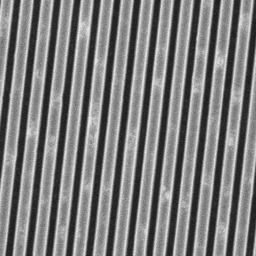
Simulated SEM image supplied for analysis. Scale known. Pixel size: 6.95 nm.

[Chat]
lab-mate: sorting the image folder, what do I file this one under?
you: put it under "parallel lines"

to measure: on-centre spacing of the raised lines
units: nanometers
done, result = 138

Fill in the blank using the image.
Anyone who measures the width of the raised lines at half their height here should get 82.1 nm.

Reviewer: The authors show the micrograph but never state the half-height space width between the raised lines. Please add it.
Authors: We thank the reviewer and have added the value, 0.0561 microns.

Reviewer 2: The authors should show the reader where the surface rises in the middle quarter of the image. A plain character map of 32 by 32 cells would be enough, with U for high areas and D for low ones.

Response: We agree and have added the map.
DDDUUDDDUUDDDUUUDDUUUDDUUUDDUUDD
DDUUUDDUUUDDUUUDDUUUDDUUUDDUUUDD
DDUUUDDUUUDDUUUDDUUUDDUUUDDUUUDD
DDUUUDDUUUDDUUUDDUUUDDUUUDDUUUDD
DDUUUDDUUUDDUUUDDUUUDDUUUDDUUUDD
DDUUUDDUUUDDUUUDDUUUDDUUUDDUUUDD
DDUUUDDUUUDDUUUDDUUUDDUUUDDUUUDD
DDUUUDDUUUDDUUUDDUUUDDUUUDDUUUDD
DDUUDDDUUUDDUUUDDUUUDDUUUDDUUUDD
DDUUDDDUUUDDUUUDDUUUDDUUUDUUUUDD
DUUUDDUUUDDUUUDDUUUDDUUUDDUUUDDU
DUUUDDUUUDDUUUDDUUUDDUUUDDUUUDDU
DUUUDDUUUDDUUUDDUUUDDUUUDDUUUDDU
DUUUDDUUUDDUUUDDUUUDDUUUDDUUUDDU
DUUUDDUUUDDUUUDDUUUDDUUUDDUUUDDU
DUUUDDUUUDDUUUDDUUUDDUUUDDUUUDDU
DUUUDDUUUDDUUUDDUUUDDUUUDDUUUDDU
DUUUDDUUUDDUUUDDUUUDDUUUDDUUUDDU
DUUUDDUUUDDUUUDDUUUDDUUUDDUUUDUU
UUUDDUUUDDUUUDDUUUDDUUUDDUUUDDUU
UUUDDUUUDDUUUDDUUUDDUUUDDUUUDDUU
UUUDDUUUDDUUUDDUUUDDUUUDDUUUDDUU
UUUDDUUUDDUUUDDUUUDDUUUDDUUUDDUU
UUUDDUUUDDUUUDDUUUDDUUUDDUUUDDUU
UUUDDUUUDDUUUDDUUUDDUUUDDUUUDDUU
UUUDDUUUDDUUUDDUUUDDUUUDDUUUDDUU
UUUDDUUDDDUUDDDUUUDDUUUDDUUUDDUU
UUUDDUUDDDUUDDDUUUDDUUUDDUUUDDUU
UUDDUUUDDUUUDDUUUDDUUUDDUUUDDUUU
UUDDUUUDDUUUDDUUUDDUUUDDUUUDDUUU
UUDDUUUDDUUUDDUUUDDUUUDDUUUDDUUU
UUDDUUUDDUUUDDUUUDDUUUDDUUUDDUUU